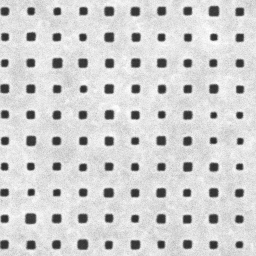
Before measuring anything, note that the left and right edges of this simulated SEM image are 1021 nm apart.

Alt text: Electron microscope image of a regular array of holes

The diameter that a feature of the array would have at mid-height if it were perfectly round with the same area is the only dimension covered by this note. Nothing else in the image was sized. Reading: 36.8 nanometers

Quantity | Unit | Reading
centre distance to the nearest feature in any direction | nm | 102